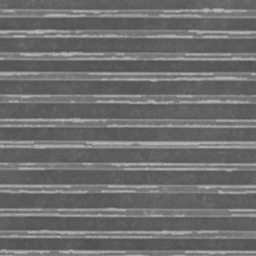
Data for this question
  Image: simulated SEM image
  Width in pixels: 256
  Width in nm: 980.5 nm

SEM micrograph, parallel lines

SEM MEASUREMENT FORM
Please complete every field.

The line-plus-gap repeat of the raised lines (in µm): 0.0846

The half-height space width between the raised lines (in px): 14.6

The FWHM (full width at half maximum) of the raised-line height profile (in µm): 0.0297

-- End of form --